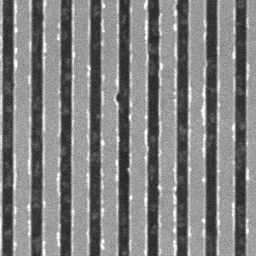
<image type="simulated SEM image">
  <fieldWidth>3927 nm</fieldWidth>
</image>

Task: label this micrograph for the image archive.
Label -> parallel lines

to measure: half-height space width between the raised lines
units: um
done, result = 0.184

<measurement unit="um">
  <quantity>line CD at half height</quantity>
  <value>0.26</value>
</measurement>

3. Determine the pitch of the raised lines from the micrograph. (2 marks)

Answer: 447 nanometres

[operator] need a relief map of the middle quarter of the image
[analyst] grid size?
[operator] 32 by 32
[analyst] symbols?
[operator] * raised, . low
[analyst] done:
..****...****....****...****...*
..****...****....****...****...*
..****...****....****...****...*
..****...****....****...****...*
..****...****....****...****...*
..****...****....****...****...*
..****...****....****...****...*
..****...****....****...****...*
..****...****....****...****...*
..****...****....****...****...*
..****...****....****...****...*
..****...****....****...****...*
..****...****...*****...****...*
..****...****...*****...****...*
..****...****....****...****...*
..****...****....****...****...*
..****...****....****...****...*
..****...****....****...****...*
..****...*****...****...****...*
..****...*****...****...****...*
..****...****....****...****...*
..****...****....****...****...*
..****...****....****...****...*
..****...****....****...****...*
..****...****....****...****...*
..****...****....****...****...*
..****...****...*****...****...*
..****...****...*****...****...*
..****...****....****...****...*
..****...****....****...****...*
..****...****....****...****...*
..****...****....****...****...*